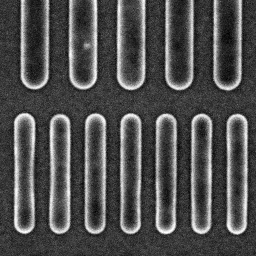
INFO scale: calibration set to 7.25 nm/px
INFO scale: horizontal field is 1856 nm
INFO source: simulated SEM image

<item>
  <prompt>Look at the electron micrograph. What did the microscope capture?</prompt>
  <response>groups of lines, slits or small figures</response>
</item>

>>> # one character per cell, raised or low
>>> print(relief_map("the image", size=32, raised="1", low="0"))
00011100011100011100011100011100
00011100011100011100011100011100
00011100011100011100011100011100
00011100011100011100011100011100
00011100011100011100011100011100
00011100011100011100011100011100
00011100011100011100011100011100
00011100011100011100011100011100
00011100011100011100011100011100
00011100011100011100011100011100
00011000011100011100011100011100
00000000000000000000000000000000
00000000000000000000000000000000
00000000000000000000000000000000
00110001000110001000100001000100
00110011100110011100110011001110
00110011100110011100110011001110
00110011100110011100110011001110
00110011100110011100110011000110
00110011100110011100110011000110
00110001100110011100110011000110
00110001100110011100110011000110
00110001100110011100110011000110
00110011100110011000110011000110
00110011100110011000110011000110
00110011100110011000110011000110
00110011100110011000110011000110
00110011100110011000110011000110
00110011100110011000110011000110
00000000000000000000000000000000
00000000000000000000000000000000
00000000000000000000000000000000